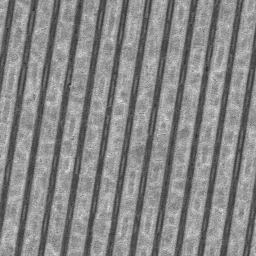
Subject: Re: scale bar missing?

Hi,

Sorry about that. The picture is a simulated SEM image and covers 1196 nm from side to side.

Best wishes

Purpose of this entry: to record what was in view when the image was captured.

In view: parallel lines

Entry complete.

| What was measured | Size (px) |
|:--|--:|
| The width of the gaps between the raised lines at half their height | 8.16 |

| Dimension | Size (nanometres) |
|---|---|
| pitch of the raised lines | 105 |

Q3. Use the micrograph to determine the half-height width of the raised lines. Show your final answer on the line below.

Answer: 68.1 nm